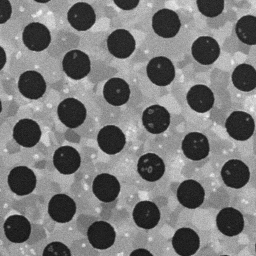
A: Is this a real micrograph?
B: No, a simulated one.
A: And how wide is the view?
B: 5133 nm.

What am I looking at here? a regular array of holes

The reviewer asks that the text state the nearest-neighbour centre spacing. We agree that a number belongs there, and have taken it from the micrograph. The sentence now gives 47.9 pixels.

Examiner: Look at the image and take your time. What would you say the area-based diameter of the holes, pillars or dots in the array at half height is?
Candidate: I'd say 0.586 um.